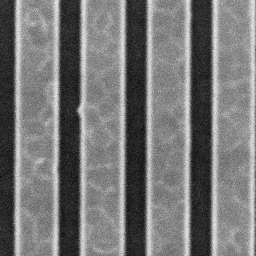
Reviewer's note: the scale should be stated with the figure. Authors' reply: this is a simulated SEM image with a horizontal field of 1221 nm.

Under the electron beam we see one or a few lines or trenches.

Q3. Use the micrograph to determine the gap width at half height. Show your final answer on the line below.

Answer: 119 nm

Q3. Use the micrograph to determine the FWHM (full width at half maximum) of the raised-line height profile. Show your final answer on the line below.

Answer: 193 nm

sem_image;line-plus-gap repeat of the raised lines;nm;313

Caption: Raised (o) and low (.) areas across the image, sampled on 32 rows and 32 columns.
..ooooo...ooooo....ooooo...ooooo
..ooooo...ooooo....ooooo...ooooo
..ooooo...ooooo....ooooo...ooooo
..ooooo...ooooo....ooooo...ooooo
..ooooo...ooooo....ooooo...ooooo
..ooooo...ooooo....ooooo...ooooo
..ooooo...ooooo....ooooo...ooooo
..ooooo...ooooo....ooooo...ooooo
..ooooo...ooooo....ooooo...ooooo
..ooooo...ooooo....ooooo...ooooo
..ooooo...ooooo....ooooo...ooooo
..ooooo...ooooo....ooooo...ooooo
..ooooo...ooooo....ooooo...ooooo
..ooooo...ooooo....ooooo...ooooo
..ooooo...ooooo....ooooo...ooooo
..ooooo...ooooo....ooooo...ooooo
..ooooo...ooooo....ooooo...ooooo
..ooooo...ooooo....ooooo...ooooo
..ooooo...ooooo....ooooo...ooooo
..ooooo...ooooo....ooooo...ooooo
..ooooo...ooooo....ooooo...ooooo
..ooooo...ooooo....ooooo...ooooo
..ooooo...ooooo....ooooo...ooooo
..ooooo...ooooo....ooooo...ooooo
..ooooo...ooooo....ooooo...ooooo
..ooooo...ooooo....ooooo...ooooo
..ooooo...ooooo....ooooo...ooooo
..ooooo...ooooo....ooooo...ooooo
..ooooo...ooooo....oooo....ooooo
..ooooo...ooooo....oooo....ooooo
..ooooo...ooooo....oooo....ooooo
..ooooo...ooooo....oooo....ooooo